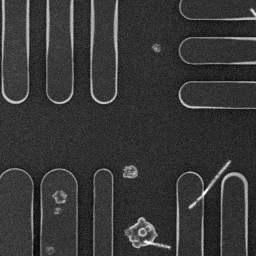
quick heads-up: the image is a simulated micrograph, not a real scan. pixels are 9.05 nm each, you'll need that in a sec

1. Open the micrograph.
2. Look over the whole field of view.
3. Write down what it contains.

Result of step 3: groups of lines, slits or small figures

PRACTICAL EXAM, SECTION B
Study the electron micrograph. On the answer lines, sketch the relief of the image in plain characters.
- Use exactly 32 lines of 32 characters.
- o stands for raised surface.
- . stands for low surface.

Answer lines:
ooo...ooo...ooo.......oooooooooo
ooo...ooo...ooo........ooooooooo
ooo...ooo...oo..................
ooo...ooo...oo..................
ooo...ooo...oo..................
ooo...ooo..ooo.........ooooooooo
ooo...ooo..oooo.......oooooooooo
oooo..ooo..oooo........ooooooooo
oooo..ooo..oooo.................
oooo..ooo..oooo.................
oooo..ooo..oooo........ooooooooo
oooo..ooo..oooo.......oooooooooo
.oo...oo....oo.........ooooooooo
................................
................................
................................
................................
................................
................................
................................
................................
.oo...ooo...oo..................
oooo.oooo...oo........ooo...ooo.
oooo.ooooo..oo........ooo...ooo.
oooo.ooooo..oo........oooo..ooo.
oooo.ooooo..oo........ooo...ooo.
oooo.ooooo..oo........ooo...ooo.
oooo.ooooo..oo........ooo...ooo.
oooo.ooooo..oo...oo...ooo...ooo.
oooo.ooooo..oo...oo...ooo...ooo.
oooo.ooooo..oo........ooo...ooo.
oooo.ooooo..oo........ooo...ooo.